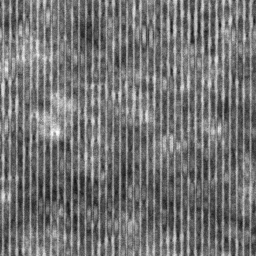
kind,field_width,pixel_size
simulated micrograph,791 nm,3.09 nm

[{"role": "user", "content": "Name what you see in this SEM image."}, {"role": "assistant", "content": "parallel lines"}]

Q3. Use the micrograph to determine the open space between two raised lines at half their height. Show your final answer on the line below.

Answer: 17.8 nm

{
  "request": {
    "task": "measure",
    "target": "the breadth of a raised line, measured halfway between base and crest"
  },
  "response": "3.1 nm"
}